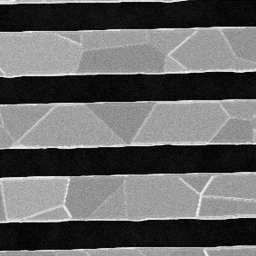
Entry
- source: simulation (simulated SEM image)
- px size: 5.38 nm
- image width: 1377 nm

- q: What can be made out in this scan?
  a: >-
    lines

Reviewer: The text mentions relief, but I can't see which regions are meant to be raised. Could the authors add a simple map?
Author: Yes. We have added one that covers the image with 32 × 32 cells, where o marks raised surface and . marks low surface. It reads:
................................
................................
................................
..........................oooooo
oooooooooooooooooooooooooooooooo
oooooooooooooooooooooooooooooooo
oooooooooooooooooooooooooooooooo
oooooooooooooooooooooooooooooooo
oooooooooooooooooooooooooooooooo
ooo.............................
................................
................................
............................oooo
oooooooooooooooooooooooooooooooo
oooooooooooooooooooooooooooooooo
oooooooooooooooooooooooooooooooo
oooooooooooooooooooooooooooooooo
oooooooooooooooooooooooooooooooo
oooooo.ooo......................
................................
................................
................................
oooooooooooooooooooooooooooooooo
oooooooooooooooooooooooooooooooo
oooooooooooooooooooooooooooooooo
oooooooooooooooooooooooooooooooo
oooooooooooooooooooooooooooooooo
ooooooooooooooooooo.............
................................
................................
................................
oooooooooooooooooooooooooooooooo